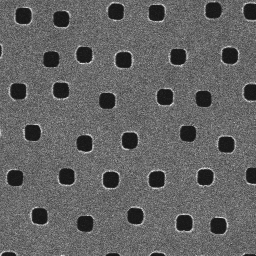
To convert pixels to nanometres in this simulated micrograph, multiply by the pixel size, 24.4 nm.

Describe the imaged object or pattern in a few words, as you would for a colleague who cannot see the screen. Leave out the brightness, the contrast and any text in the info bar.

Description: a regular array of holes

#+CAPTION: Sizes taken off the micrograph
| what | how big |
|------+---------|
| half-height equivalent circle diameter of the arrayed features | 418 nm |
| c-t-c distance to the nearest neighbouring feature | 976 nm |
